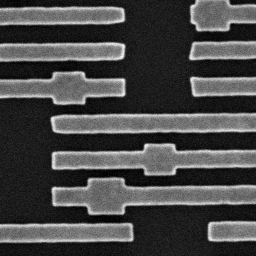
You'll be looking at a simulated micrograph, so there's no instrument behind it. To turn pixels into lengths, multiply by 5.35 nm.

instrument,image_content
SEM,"wiring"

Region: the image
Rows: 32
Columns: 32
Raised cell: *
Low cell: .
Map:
........................*****...
***************.........********
***************.........********
.........................****...
................................
....***********.........********
***************.........********
*******.........................
................................
.......****.....................
****************........********
****************........********
.......****.....................
................................
.......*************************
......**************************
.......***********..............
................................
..................****..........
.......*************************
.......*************************
..................****..........
...........****.................
.........***********************
.......*************************
.......***************.***......
...........****.................
................................
*****************.........******
*****************.........******
................................
................................